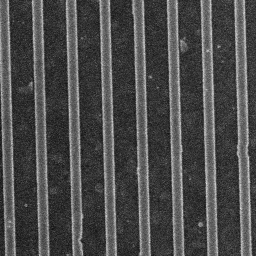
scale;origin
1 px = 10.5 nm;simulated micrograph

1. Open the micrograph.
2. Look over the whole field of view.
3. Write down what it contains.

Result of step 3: parallel lines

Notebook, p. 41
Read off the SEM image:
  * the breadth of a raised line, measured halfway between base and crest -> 102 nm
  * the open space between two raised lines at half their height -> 245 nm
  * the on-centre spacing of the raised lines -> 353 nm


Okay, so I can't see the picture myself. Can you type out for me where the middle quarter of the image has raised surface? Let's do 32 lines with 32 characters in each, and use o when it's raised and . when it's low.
.oo......ooo......oo......ooo...
.oo.......oo......oo......ooo...
.oo.......oo......oo......ooo...
.ooo......oo......oo......ooo...
.ooo......oo......oo......ooo...
.ooo......oo......oo......ooo...
.ooo......oo......oo......ooo...
.ooo......oo......oo......ooo...
.ooo......oo......oo......ooo...
.ooo......oo......oo.......oo...
.ooo......oo......oo.......oo...
.ooo......oo......oo....o..oo...
.ooo......oo......ooo......oo...
.ooo......oo......ooo......oo..o
.ooo......oo......ooo......oo...
.ooo......oo......ooo......oo...
.ooo......oo......ooo......oo...
.ooo......oo......ooo......oo...
..oo......oo......ooo......oo...
..oo......oo......ooo......oo...
..oo......oo.......oo......oo...
..oo......oo.......oo......oo...
..oo......oo......ooo......oo...
..oo......oo......ooo......oo...
..oo......oo......ooo......oo...
..oo......oo....o.ooo......oo...
..oo......oo....o.ooo......oo...
..oo......oo......ooo......oo...
..oo......oo.......oo......oo...
..oo......ooo......oo......oo...
..oo....o.ooo......oo......oo...
..oo.....oooo......oo......ooo..